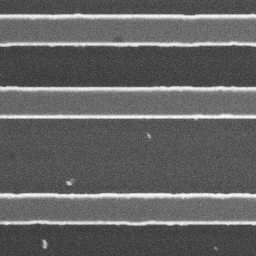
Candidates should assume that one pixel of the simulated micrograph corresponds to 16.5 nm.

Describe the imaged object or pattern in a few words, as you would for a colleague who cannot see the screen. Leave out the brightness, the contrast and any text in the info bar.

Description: lines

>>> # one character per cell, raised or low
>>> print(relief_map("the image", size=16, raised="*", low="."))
................
****************
****************
................
................
****************
****************
................
................
................
................
................
****************
****************
................
................